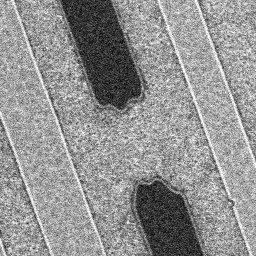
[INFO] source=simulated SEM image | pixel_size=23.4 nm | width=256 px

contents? one or a few lines or trenches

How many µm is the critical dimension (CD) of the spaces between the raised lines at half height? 1.02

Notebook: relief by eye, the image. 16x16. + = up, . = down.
+...+++...++....
+...++++..+++...
++...+++...++...
++...+++...+++..
++...++++...++..
+++...+++...++..
+++...++....+++.
++++.........++.
.+++.........++.
.+++.........+++
.++++.........++
..+++....+....++
..+++...++++...+
..++++...+++...+
...+++...+++...+
...+++...++++...